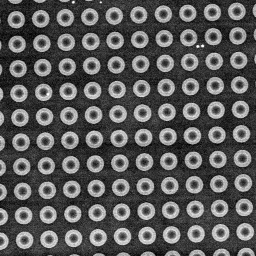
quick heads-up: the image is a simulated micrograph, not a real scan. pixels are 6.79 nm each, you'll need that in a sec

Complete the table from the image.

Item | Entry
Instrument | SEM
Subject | an array of small figures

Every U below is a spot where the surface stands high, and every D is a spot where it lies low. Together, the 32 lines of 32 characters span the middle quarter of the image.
UUUDDUUUUDDUUUUDDUUUUDDUUUUDDDUU
UUUDDUUUUDDUUUUDDDUUUDDDUUUDDDDU
UUDDDDUUDDDDDDDDDDDDDDDDDDDDDDDD
DDDDDDDDDDDDDDDDDDDDDDDDDDDDDDDD
DDDDDDDDDDDDUUDDDDUUUDDDUUUDDDUU
UUUDDUUUUDDUUUUDDUUUUDDUUUUUDDUU
UUUDDUUUUDDUUUUDDUUUUDDDUUUUDDUU
UUUDDUUUUDDUUUUDDDUUUDDDUUUDDDDU
UUDDDDUUDDDDDDDDDDDDDDDDDDDDDDDD
DDDDDDDDDDDDDDDDDDDDDDDDDDDDDDDD
DDDDDDDDDDDDDUDDDDUUUDDDUUUDDDUU
UUUDDDUUUDDDUUUDDDUUUUDDUUUUDDUU
UUUDDUUUUDDUUUUUDDUUUUDDUUUUDDUU
UUUDDUUUUDDDUUUDDDUUUDDDUUUDDDUU
UUUDDDUUUDDDDUDDDDDDDDDDDDDDDDDD
DDDDDDDDDDDDDDDDDDDDDDDDDDDDDDDD
DDDDDDDDDDDDDDDDDDDUUDDDDUUDDDUU
UUUDDDUUUDDDUUUUDDUUUUDDUUUUDDUU
UUUUDDUUUUDDUUUUDDUUUUDDUUUUDDUU
UUUUDDUUUUDDUUUUDDUUUUDDUUUUDDDU
UUUDDDUUUDDDDUUDDDDDDDDDDDDDDDDD
DDDDDDDDDDDDDDDDDDDDDDDDDDDDDDDD
DDDDDDDDDDDDDDDDDDDUUDDDDUUDDDDU
UUUDDDUUUDDDUUUUDDUUUUDDUUUUDDUU
UUUUDDUUUUDDUUUUDDUUUUDDUUUUDDUU
UUUUDDUUUUDDUUUUDDUUUUDDUUUUDDDU
UUUDDDUUUDDDDUUDDDDUUDDDDDDDDDDD
DDDDDDDDDDDDDDDDDDDDDDDDDDDDDDDD
DDDDDDDDDDDDDDDDDDDDDDDDDDUDDDDU
DUUDDDDUUDDDDUUUDDDUUUDDDUUUDDDU
UUUUDDUUUUDDUUUUDDUUUUDDUUUUUDDU
UUUUDDUUUUDDUUUUDDUUUUDDDUUUDDDU